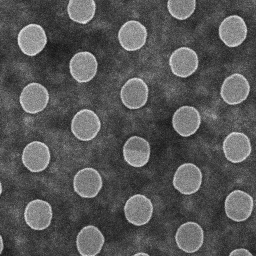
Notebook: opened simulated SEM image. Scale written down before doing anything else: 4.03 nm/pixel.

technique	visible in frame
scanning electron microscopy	a regular array of raised bodies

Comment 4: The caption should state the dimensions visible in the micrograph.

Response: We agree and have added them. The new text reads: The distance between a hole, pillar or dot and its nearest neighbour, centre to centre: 233 nm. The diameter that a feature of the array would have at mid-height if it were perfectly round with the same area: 0.116 µm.